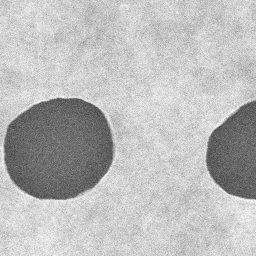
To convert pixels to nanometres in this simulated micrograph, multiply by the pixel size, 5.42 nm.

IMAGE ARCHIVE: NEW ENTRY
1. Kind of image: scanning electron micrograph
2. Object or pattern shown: holes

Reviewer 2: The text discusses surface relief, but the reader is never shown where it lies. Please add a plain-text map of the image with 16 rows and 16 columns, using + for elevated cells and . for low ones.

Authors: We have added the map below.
++++++++++++++++
++++++++++++++++
++++++++++++++++
++++++++++++++++
++++++++++++++++
++++++++++++++++
++....+++++++++.
+......+++++++..
.......++++++...
.......++++++...
.......++++++...
+.....++++++++..
++++++++++++++++
++++++++++++++++
++++++++++++++++
++++++++++++++++